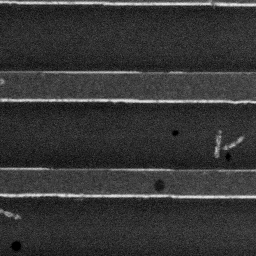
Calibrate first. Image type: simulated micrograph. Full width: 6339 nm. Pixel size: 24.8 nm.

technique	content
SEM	lines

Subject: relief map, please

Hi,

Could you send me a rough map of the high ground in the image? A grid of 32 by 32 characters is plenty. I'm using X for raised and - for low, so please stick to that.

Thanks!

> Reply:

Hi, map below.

------------------XX---XXXXXXXXX
--------------------------------
--------------------------------
--------------------------------
--------------------------------
--------------------------------
--------------------------------
--------------------------------
--------------------------------
XXXXXXXXXXXXXXXXXXXXXXXXXXXXXXXX
XXXXXXXXXXXXXXXXXXXXXXXXXXXXXXXX
XXXXXXXXXXXXXXXXXXXXXXXXXXXXXXXX
---------XXX-XXXXXXXXXXXXXXXXXXX
--------------------------------
--------------------------------
--------------------------------
--------------------------------
--------------------------------
--------------------------------
--------------------------------
--------------------------------
XXXXXXXXXXXXXXXXXXXXXXXXXXXXXXXX
XXXXXXXXXXXXXXXXXXXXXXXXXXXXXXXX
XXXXXXXXXXXXXXXXXXXXXXXXXXXXXXXX
----------------XXXXXXXXXXXXXXXX
--------------------------------
--------------------------------
--------------------------------
--------------------------------
--------------------------------
--------------------------------
--------------------------------